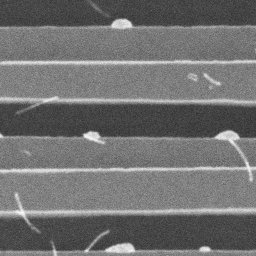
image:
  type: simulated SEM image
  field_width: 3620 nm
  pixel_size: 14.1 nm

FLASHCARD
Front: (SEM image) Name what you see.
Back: lines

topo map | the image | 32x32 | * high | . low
................................
................................
...............*................
********************************
********************************
********************************
********************************
********************************
********************************
********************************
********************************
********************************
....****************************
................................
................................
................................
...........*................*...
********************************
********************************
********************************
********************************
********************************
********************************
********************************
********************************
********************************
***********.....................
................................
................................
................................
...............*................
********************************